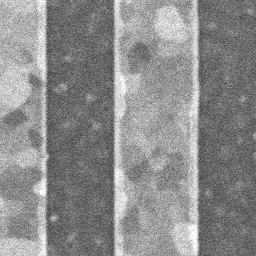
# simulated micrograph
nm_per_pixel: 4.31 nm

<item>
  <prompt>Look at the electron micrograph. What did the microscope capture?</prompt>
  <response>one or a few lines or trenches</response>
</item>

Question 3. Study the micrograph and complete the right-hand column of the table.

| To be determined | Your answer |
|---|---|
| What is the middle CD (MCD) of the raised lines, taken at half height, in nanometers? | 340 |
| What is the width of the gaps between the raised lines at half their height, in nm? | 310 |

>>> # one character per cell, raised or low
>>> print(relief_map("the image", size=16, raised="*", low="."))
***....*****....
***....*****....
***....*****....
***....*****....
***....*****....
***....*****....
***....*****....
***....*****....
***....*****....
***....*****....
***....*****....
***....*****....
***....*****....
***....*****....
***....*****....
***....*****....